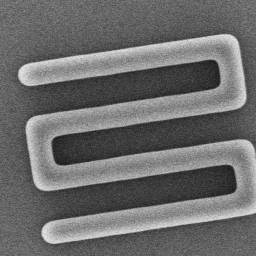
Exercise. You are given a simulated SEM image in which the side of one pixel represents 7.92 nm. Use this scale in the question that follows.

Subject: groups of lines, slits or small figures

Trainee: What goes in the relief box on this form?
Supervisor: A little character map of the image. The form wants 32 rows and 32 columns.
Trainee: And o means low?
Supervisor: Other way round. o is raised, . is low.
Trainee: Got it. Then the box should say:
................................
................................
................................
................................
...........................oo...
....................oooooooooo..
.............ooooooooooooooooo..
......oooooooooooooooooooo.ooo..
...oooooooooooooooo........ooo..
..oooooooooo................oo..
...ooo.....................oooo.
........................ooooooo.
..................ooooooooooooo.
...........ooooooooooooooooooo..
.....ooooooooooooooooooo........
...oooooooooooooo...............
...ooooooo......................
...oooo.........................
....oo.................ooooooooo
....ooo.........oooooooooooooooo
....ooo..ooooooooooooooooooooooo
....oooooooooooooooooo.......ooo
....ooooooooooo...............oo
.....oooo.....................oo
...........................ooooo
.....................ooooooooooo
..............oooooooooooooooooo
........ooooooooooooooooooo.....
.....ooooooooooooooo............
.....oooooooo...................
................................
................................